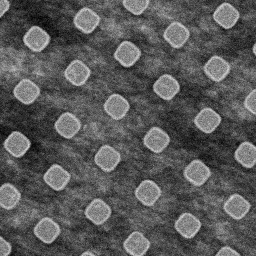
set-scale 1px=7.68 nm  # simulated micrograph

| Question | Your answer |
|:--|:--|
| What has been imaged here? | a regular array of raised bodies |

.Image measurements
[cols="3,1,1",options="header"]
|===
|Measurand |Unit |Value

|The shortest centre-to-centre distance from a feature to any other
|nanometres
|400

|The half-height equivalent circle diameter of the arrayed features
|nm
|182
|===